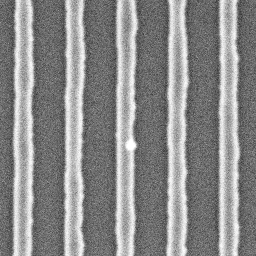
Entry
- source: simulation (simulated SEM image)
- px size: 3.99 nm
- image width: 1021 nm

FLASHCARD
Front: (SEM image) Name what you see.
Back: lines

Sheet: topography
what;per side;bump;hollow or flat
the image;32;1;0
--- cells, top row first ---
00110000110000011000011000001000
00110000110000011000011000001000
00110000110000011000011000001000
00110000110000011000011000001000
00110000110000011000011000001000
00110000110000011000011000001000
00110000111000011000011000001100
00110000111000011000011000001100
00110000110000011000011000001100
00110000110000011000011000001100
00110000110000011000011000001100
00110000110000011000011000001100
00110000110000011000011000001100
00110000110000011000011000011100
00110000110000011000011000011100
00110000110000011000011000001100
00110000110000010000011000001100
00110000110000011000011000001100
00110000110000011000011000001100
00110000110000011000011000011100
00110000110000011000011000001100
00110000110000011000011000001100
00110000110000011000011000001100
00110000110000011000011000001100
00110000110000011000011000001100
00110000110000011000011000001100
00110000110000011000011000001100
00110000110000011000011000001100
00110000110000011000011000001100
00110000110000011000011000001100
00110000110000011000011000011100
00110000110000011000011000001100